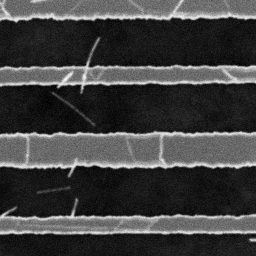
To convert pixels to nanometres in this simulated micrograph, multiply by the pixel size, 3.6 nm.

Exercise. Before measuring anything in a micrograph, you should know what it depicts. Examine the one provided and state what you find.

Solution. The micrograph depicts lines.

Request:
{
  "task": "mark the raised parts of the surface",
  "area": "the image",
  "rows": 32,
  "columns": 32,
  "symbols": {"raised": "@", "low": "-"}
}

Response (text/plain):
@@@@@@@@@@@@@@@@@@@@@@@@@@@@@@@@
@@@@@@@@@@@@@@@@@@@@@@@@@@@@@@@@
-@@----@------------------------
--------------------------------
--------------------------------
--------------------------------
--------------------------------
--------------------------------
@---@@@-@@@@@@@@@@@@@@@@@@@@@@@@
@@@@@@@@@@@@@@@@@@@@@@@@@@@@@@@@
@@@--@@@@@@--@------------------
--------------------------------
--------------------------------
--------------------------------
--------------------------------
--------------------------------
--------------------------------
@@@@@@@@@@@@@@@@@@@@@@@@@@@@@@@@
@@@@@@@@@@@@@@@@@@@@@@@@@@@@@@@@
@@@@@@@@@@@@@@@@@@@@@@@@@@@@@@@@
@@@@@@@@@@@@@@@@@@@@@@@@@@@@@@@@
--------------------------------
--------------------------------
--------------------------------
--------------------------------
--------------------------------
--------------------------------
@@@@@@@@@@@@@@@@@@@@@@@@@@@@@@@@
@@@@@@@@@@@@@@@@@@@@@@@@@@@@@@@@
--------------------------------
--------------------------------
--------------------------------